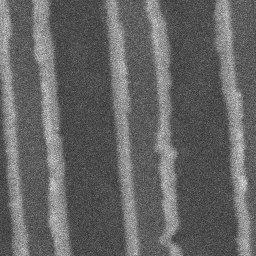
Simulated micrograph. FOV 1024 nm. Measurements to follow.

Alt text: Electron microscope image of one or a few lines or trenches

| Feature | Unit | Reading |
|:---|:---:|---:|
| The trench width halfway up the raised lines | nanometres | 268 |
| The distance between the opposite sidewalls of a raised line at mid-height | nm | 179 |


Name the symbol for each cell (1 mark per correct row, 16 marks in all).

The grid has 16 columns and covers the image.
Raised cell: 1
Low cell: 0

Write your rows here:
1110000111000011
1110000111000011
1110000111000011
1110000111000011
1110000111000011
1110000111000011
0110000111000011
0110000011000001
0110000011000001
0111000011100001
0111000011100001
0111000011100001
0111000011100001
0111000011100001
0111000011100001
0111000011100001